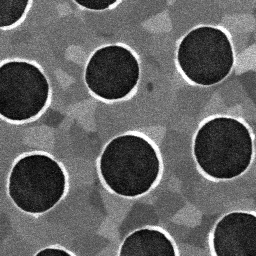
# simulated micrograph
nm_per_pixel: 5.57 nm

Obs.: holes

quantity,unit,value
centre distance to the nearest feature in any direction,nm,526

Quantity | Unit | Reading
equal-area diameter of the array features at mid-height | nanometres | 321